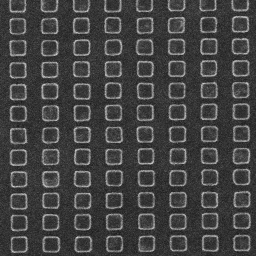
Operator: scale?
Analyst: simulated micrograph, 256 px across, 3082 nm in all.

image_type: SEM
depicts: a regular array of raised bodies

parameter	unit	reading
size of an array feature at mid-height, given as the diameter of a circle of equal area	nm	206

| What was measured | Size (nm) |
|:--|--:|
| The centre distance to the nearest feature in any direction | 261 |